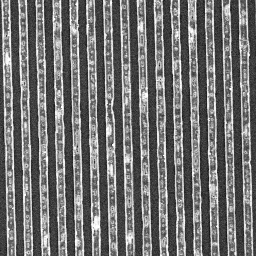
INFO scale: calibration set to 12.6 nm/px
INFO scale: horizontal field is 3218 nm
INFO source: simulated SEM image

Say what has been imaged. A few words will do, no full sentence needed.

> parallel lines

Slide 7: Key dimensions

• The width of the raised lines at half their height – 0.099 µm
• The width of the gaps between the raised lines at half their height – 112 nm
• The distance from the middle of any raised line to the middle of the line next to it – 0.213 microns